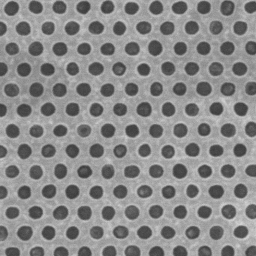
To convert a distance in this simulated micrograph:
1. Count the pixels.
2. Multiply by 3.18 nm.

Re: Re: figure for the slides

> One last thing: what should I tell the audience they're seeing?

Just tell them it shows a regular array of holes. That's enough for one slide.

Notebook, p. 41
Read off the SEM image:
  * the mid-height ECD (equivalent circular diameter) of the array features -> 47.1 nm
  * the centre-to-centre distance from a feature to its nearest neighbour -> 73.6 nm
